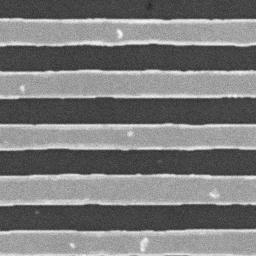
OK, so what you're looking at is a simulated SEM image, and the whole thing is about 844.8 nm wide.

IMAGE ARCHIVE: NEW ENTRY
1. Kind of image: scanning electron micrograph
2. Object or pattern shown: lines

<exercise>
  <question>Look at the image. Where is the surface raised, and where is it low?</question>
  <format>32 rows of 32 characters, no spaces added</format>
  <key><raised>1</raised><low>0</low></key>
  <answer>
00000000000000000000000000000000
00000000000000000000000000000000
11111100111111110111000111000111
11111111111111111111111111111111
11111111111111111111111111111111
11111111100011110000000000111111
00000000000000000000000000000000
00000000000000000000000000000000
00000000000000000000000000000000
11111111111111111111111111111111
11111111111111111111111111111111
11111111111111111111111111111111
00000000000000000000000000000000
00000000000000000000000000000000
00000000000000000000000000000000
00000000000000000000000000000000
11111111111111111111111111111111
11111111111111111111111111111111
11111000111111111111111111000000
00000000000000000000000000000000
00000000000000000000000000000000
00000000000000000000000000000000
11111111111111111111111111111111
11111111111111111111111111111111
11111111111111111111111111111111
11111111111011111111111000011011
00000000000000000000000000000000
00000000000000000000000000000000
00000000000000000000000000000000
11111111111111111111111111111111
11111111111111111111111111111111
11111111111111111111111111111111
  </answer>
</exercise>